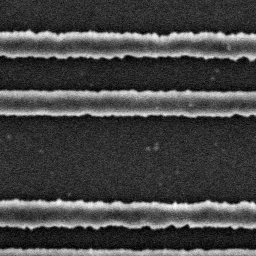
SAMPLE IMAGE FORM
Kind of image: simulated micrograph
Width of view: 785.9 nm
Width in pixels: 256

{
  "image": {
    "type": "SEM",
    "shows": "lines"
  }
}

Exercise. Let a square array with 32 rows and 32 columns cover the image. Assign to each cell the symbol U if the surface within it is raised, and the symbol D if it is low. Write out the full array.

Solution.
DDDDDDDDDDDDDDDDDDDDDDDDDDDDDDDD
DDDDDDDDDDDDDDDDDDDDDDDDDDDDDDDD
DDDDDDDDDDDDDDDDDDDDDDDDDDDDDDDD
DDDDDDDDDDDDDDDDDDDDDDDDDDDDDDDD
UUUUUUUUUUUUUUUUUUUUDUUUUUUUDUUU
UUUUUUUUUUUUUUUUUUUUUUUUUUUUUUUU
UUUUUUUUUUUUUUUUUUUUUUUUUUUUUUUU
DDDDDDDDDDDDDDDDDDDDDDDDDDDDDDDD
DDDDDDDDDDDDDDDDDDDDDDDDDDDDDDDD
DDDDDDDDDDDDDDDDDDDDDDDDDDDDDDDD
DDDDDDDDDDDDDDDDDDDDDDDDDDDDDDDD
UUDUUDDUDDDDDDDUUDDDDDDUDDDDDDDD
UUUUUUUUUUUUUUUUUUUUUUUUUUUUUUUU
UUUUUUUUUUUUUUUUUUUUUUUUUUUUUUUU
DDDDDDDDDDDDDDDDDDDDDDDUUDUUUDDD
DDDDDDDDDDDDDDDDDDDDDDDDDDDDDDDD
DDDDDDDDDDDDDDDDDDDDDDDDDDDDDDDD
DDDDDDDDDDDDDDDDDDDDDDDDDDDDDDDD
DDDDDDDDDDDDDDDDDDDDDDDDDDDDDDDD
DDDDDDDDDDDDDDDDDDDDDDDDDDDDDDDD
DDDDDDDDDDDDDDDDDDDDDDDDDDDDDDDD
DDDDDDDDDDDDDDDDDDDDDDDDDDDDDDDD
DDDDDDDDDDDDDDDDDDDDDDDDDDDDDDDD
DDDDDDDDDDDDDDDDDDDDDDDDDDDDDDDD
DDDDDDDDDDDDDDDDDDDDDDDDDDDDDDDD
UUUUUUUUUUUUUUUDUUUUDDDDDUUDDDUU
UUUUUUUUUUUUUUUUUUUUUUUUUUUUUUUU
UUUUUUUUUUUUUUUUUUUUUUUUUUUUUUUU
DDDDDDDDDDDDDDDDDDDUDDDDDDDDDDDD
DDDDDDDDDDDDDDDDDDDDDDDDDDDDDDDD
DDDDDDDDDDDDDDDDDDDDDDDDDDDDDDDD
UUUUUUUUUUUUUUUUUUUUUUUUUUUUUUUU